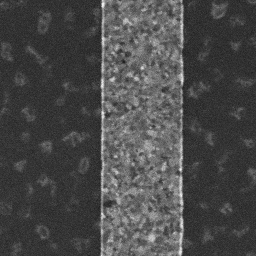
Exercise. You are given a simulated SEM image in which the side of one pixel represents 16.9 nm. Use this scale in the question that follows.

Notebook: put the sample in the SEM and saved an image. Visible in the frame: one or a few lines or trenches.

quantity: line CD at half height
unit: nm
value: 1340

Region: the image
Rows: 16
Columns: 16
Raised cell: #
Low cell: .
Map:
......#####.....
......#####.....
......#####.....
......#####.....
......#####.....
......#####.....
......#####.....
......#####.....
......#####.....
......#####.....
......#####.....
......#####.....
......#####.....
......#####.....
......#####.....
......#####.....